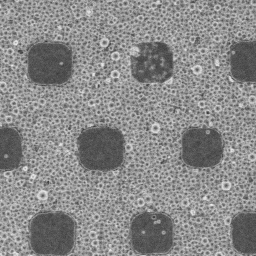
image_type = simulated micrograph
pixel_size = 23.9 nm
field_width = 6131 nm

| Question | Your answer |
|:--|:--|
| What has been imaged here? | raised bodies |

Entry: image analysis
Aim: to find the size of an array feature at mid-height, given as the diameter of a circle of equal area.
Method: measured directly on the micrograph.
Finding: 1100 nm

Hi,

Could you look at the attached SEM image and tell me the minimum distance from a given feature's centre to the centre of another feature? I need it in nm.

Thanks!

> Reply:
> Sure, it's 2370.